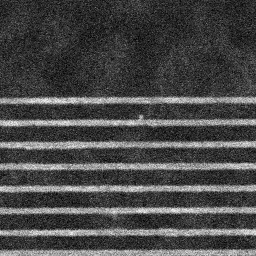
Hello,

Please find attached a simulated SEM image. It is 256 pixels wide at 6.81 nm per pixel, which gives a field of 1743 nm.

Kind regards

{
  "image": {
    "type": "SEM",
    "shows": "parallel lines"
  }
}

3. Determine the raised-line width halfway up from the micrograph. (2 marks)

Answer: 0.0315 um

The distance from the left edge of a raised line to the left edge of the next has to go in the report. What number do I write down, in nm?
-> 150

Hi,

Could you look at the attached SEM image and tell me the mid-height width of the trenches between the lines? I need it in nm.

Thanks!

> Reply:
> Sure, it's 117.